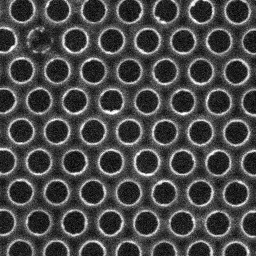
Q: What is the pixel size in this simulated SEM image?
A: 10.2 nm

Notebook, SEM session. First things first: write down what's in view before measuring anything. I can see a regular array of holes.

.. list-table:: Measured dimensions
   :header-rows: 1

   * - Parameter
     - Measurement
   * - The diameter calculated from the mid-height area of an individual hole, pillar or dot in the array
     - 0.233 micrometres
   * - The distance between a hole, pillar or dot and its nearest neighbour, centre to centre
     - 355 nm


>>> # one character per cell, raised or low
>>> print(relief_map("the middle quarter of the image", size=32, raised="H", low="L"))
LHHHHLLLLLHHHHLLLLLHHHHLLLLLHHHH
LHHHLLLLLLHHHLLLLLLHHHLLLLLLHHHL
LHHHLLLLLLHHHHLLLLLHHHHLLLLLHHHL
LHHHHLLLLLHHHHLLLLLHHHHLLLLLHHHH
HHHHHHLLLHHHHHHLLLHHHHHHLLLHHHHH
HHHHHHHHHHHHHHHHHHHHHHHHHHHHHHHH
HHLHHHHHHHHLLHHHHHHHLLHHHHHHHHHH
HLLLLHHHHHLLLLHHHHHLLLLHHHHHLLLL
LLLLLLHHHLLLLLLHHHLLLLLHHHHLLLLL
LLLLLLHHHLLLLLLHHHLLLLLLHHHLLLLL
LLLLLHHHHLLLLLLHHHLLLLLHHHHLLLLL
HLLLHHHHHHLLLLHHHHHLLLLHHHHHLLLL
HHHHHHHHHHHHHHHHHHHHHHHHHHHHHHHH
HHHHHHHHHHHHHHHHHHHHHHHHHHHHHHHH
HHHHHHLLLHHHHHHLLLHHHHHHLLHHHHHH
LHHHHLLLLLHHHHLLLLLHHHHLLLLLHHHH
LHHHLLLLLLHHHHLLLLLHHHHLLLLLHHHL
LHHHLLLLLLHHHHLLLLLHHHLLLLLLHHHL
LHHHHLLLLLHHHHLLLLLHHHHLLLLLHHHH
HHHHHHLLLHHHHHHLLLHHHHHLLLLHHHHH
HHHHHHHHHHHHHHHHHHHHHHHHHHHHHHHH
HHHHHHHHHHHHHHHHHHHHLHHHHHHHHHHH
HLLLLHHHHHLLLLHHHHHLLLLHHHHHLLLL
LLLLLHHHHLLLLLHHHHLLLLLHHHHLLLLL
LLLLLHHHHLLLLLLHHHLLLLLLHHHLLLLL
LLLLLHHHHLLLLLHHHHLLLLLLHHHLLLLL
HLLLLHHHHHLLLLHHHHHLLLLHHHHLLLLL
HHHHHHHHHHHHHHHHHHHHHHHHHHHHHLHH
HHHHHHHHHHHHHHHHHHHHHHHHHHHHHHHH
HHHHHHLLLHHHHHHLLHHHHHHHHLHHHHHH
LHHHHLLLLLHHHHLLLLLHHHHLLLLHHHHH
LHHHLLLLLLHHHLLLLLLHHHHLLLLLHHHL